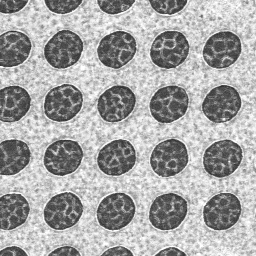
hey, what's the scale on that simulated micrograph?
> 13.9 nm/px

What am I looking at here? a regular array of holes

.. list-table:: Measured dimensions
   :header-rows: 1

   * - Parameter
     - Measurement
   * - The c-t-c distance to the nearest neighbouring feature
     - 52.6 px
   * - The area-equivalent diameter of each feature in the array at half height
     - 540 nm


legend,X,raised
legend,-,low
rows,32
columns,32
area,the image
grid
---XXX----XX-----XX----XXXXXXXXX
--XXXX---XXXX---XXXX--XXXXXXXXXX
XXXXXXXXXXXXXXXXXXXXXXXXXXXXXXXX
XXXXXXXXXXXXXXXXXXXXXXXXXXXXXXXX
-X-XXXX---XXX----XXX---XXX----XX
----XX----XX-----XX-----XX----XX
----X-----XX-----XX-----X-----XX
---XXX----XX----XXX----XX-----XX
XXXXXXX-XXXXXX-XXXXX--XXXXX-XXXX
XXXXXXXXXXXXXXXXXXXXXXXXXXXXXXXX
XXXXXXXX-XXXXXXXXXXXXXXXXXXXXXXX
---XXX----XXX----XX----XXX----XX
----XX----XX-----XX-----X-----XX
----X-----XX-----XX----XX-----XX
---XXX---XXXX---XXX----XXX---XXX
XXXXXXXXXXXXXXXXXXXXXXXXXXXXXXXX
XXXXXXXXXXXXXXXXXXXXXXXXXXXXXXXX
X-XXXXXX-XXXXX--XXXXX-XXXXX--XXX
----XX----XXX----XX----XXX----XX
----X-----XX-----XX-----X-----XX
----X-----XX-----XX----XX-----XX
---XXX---XXXX---XXX----XXX---XXX
XXXXXXXXXXXXXXXXXXXXXXXXXXXXXXXX
XXXXXXXXXXXXXXXXXXXXXXXXXXXXXXXX
---XXXX---XXX---XXXX---XXXX--XXX
----XX----XX-----XX----XXX----XX
----X-----XX-----XX----XX-----XX
---XXX----XX-----XX----XX-----XX
--XXXX---XXXX--XXXX---XXXX---XXX
XXXXXXXXXXXXXXXXXXXXXXXXXXXXXXXX
XXXXXXXXXXXXXXXXXXXXXXXXXXXXXXXX
---XXX----XXX---XXXX---XXXXXXXXX